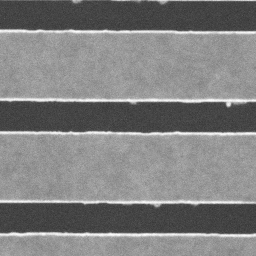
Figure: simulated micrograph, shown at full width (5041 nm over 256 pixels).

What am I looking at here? lines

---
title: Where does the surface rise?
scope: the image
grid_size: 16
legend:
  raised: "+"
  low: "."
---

................
................
++++++++++++++++
++++++++++++++++
++++++++++++++++
++++++++++++++++
................
................
++++++++++++++++
++++++++++++++++
++++++++++++++++
++++++++++++++++
++++++++++++++++
................
................
++++++++++++++++